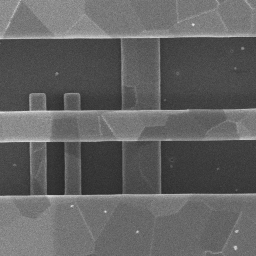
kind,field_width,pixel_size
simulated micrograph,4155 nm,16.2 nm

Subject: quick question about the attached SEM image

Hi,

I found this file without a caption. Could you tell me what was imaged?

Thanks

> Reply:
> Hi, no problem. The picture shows wiring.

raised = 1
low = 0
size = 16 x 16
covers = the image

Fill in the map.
1111111111111111
1111111111111111
0000000000000000
0000000000000000
0000000000000000
0000000000000000
0000000000000000
1111111111111111
1111111111111111
0000000000000000
0000000000000000
0000000000000000
1111111111111111
1111111111111111
1111111111111111
1111111111111111